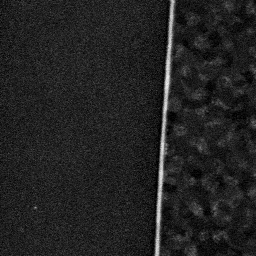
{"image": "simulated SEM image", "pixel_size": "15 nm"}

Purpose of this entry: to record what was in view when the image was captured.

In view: one or a few lines or trenches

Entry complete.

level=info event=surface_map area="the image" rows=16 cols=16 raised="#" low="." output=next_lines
...........#####
...........#####
...........#####
...........#####
..........######
..........######
..........######
..........######
..........######
..........######
..........######
..........######
..........######
..........######
..........######
..........######